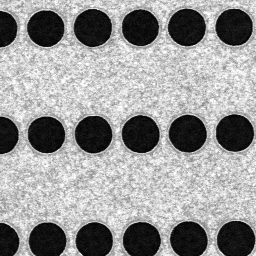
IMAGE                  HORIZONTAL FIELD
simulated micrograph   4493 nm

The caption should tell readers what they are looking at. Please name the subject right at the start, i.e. a regular array of holes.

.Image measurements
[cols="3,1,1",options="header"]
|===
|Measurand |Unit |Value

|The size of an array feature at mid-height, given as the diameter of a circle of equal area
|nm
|667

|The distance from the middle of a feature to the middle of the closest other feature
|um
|0.826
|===